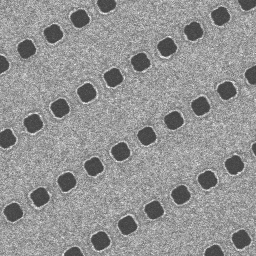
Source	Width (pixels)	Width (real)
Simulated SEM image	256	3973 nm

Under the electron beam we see a regular array of holes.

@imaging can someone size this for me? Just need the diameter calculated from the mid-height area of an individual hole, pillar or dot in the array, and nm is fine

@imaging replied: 286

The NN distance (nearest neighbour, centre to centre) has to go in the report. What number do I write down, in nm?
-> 476